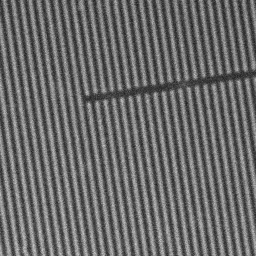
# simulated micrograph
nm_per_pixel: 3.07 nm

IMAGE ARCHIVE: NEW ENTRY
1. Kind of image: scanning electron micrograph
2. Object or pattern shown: parallel lines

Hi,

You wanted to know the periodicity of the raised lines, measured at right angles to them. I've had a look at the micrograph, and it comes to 25.9 nm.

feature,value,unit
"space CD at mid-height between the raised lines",17.8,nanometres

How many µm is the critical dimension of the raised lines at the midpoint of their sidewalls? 0.0087